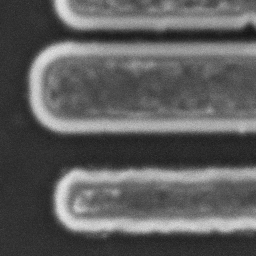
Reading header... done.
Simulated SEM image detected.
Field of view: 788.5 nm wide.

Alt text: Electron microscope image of one or a few lines or trenches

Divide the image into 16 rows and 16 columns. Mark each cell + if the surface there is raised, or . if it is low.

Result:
....++++++++++++
.........+......
................
...+++++++++++++
..++++++++++++++
..++++++++++++++
..++++++++++++++
...+++++++++++++
................
................
................
....++++++++++++
....++++++++++++
....++++++++++++
................
................